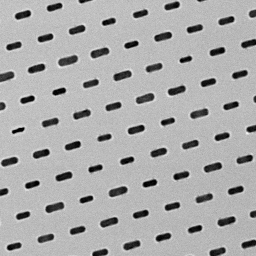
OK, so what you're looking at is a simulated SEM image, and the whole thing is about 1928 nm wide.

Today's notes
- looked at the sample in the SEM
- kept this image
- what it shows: a regular array of holes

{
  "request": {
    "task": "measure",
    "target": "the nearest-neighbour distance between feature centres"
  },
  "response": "241 nm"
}